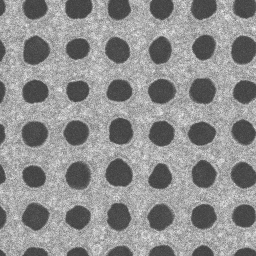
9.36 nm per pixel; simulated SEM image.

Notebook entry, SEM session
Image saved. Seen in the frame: a regular array of holes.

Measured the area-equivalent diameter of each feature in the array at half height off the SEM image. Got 0.239 microns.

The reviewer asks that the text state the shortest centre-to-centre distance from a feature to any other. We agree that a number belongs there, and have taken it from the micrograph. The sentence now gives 380 nm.